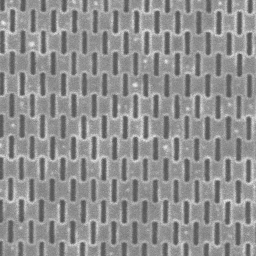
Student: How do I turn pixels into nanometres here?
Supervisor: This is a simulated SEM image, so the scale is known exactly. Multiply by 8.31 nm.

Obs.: a regular array of holes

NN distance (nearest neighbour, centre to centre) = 169 nm